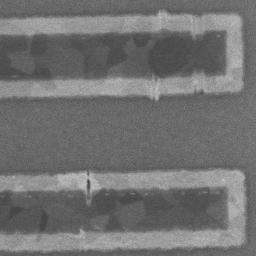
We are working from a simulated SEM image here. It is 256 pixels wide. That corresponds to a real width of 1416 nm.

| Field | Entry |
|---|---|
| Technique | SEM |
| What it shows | one or a few lines or trenches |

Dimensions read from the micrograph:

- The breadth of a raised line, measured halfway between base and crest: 328 nanometers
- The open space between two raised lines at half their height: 528 nm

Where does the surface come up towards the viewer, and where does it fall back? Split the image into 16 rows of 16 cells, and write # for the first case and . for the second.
................
.........###.#..
###############.
###############.
###############.
##.......#......
................
................
................
................
................
###############.
###############.
###############.
###############.
................